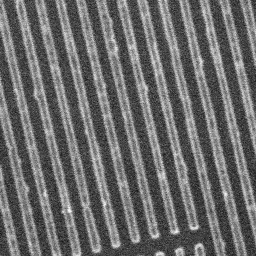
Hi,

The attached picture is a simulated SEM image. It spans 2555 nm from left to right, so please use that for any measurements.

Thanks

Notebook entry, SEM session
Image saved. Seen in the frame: parallel lines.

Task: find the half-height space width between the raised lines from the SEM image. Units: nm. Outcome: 128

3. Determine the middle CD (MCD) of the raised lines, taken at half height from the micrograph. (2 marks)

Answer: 0.0778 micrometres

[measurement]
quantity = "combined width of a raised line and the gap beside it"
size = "200 nm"